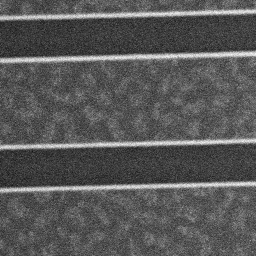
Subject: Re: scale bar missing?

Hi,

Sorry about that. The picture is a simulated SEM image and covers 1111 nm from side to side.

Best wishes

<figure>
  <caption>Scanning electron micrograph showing one or a few lines or trenches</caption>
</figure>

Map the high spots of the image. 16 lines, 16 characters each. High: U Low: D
UUUUUUUUUUUUUUUU
DDDDDDDDDDDDDDDD
DDDDDDDDDDDDDDDD
DDDDDDDDDDUUUUUU
UUUUUUUUUUUUUUUU
UUUUUUUUUUUUUUUU
UUUUUUUUUUUUUUUU
UUUUUUUUUUUUUUUU
UUUUUUUUUUUUUUUU
DDDDDDDDDDDDDDDD
DDDDDDDDDDDDDDDD
DDDDDDDDDDDDDDUU
UUUUUUUUUUUUUUUU
UUUUUUUUUUUUUUUU
UUUUUUUUUUUUUUUU
UUUUUUUUUUUUUUUU